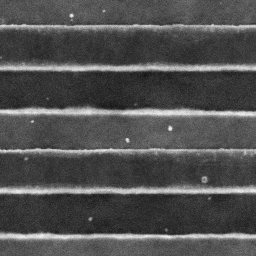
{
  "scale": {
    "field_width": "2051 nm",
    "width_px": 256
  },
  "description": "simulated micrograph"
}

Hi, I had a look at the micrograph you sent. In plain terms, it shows lines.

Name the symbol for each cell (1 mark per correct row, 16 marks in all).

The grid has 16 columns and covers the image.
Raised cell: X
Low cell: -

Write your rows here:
XXXXXXXXXXXXXXXX
XXXXXXXXXXXXXXXX
XXXXXXXXXXXXXXXX
XXXXXXXXXXXXXXXX
----------------
----------------
----------------
XXXXXXXXXXXXXXXX
XXXXXXXXXXXXXXXX
XXXXXXXXXXXXXXXX
XXXXXXXXXXXXXXXX
XXXXXXXXXXXXXXXX
----------------
----------------
----------------
XXXXXXXXXXXXXXXX